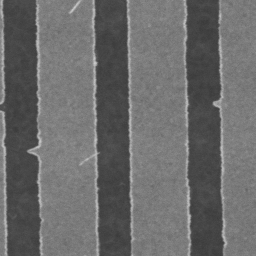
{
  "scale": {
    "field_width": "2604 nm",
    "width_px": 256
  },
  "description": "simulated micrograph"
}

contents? one or a few lines or trenches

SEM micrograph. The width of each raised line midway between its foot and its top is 594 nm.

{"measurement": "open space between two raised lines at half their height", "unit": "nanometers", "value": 337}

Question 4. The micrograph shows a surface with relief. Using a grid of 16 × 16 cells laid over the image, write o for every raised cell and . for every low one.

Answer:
..oooooooooo..oo
..oooo..oooo..oo
..oooo..oooo..oo
..oooo..oooo..oo
..oooo..oooo..oo
..oooo..oooo..oo
..oooo..oooo..oo
..oooo..oooo..oo
..oooo..oooo..oo
..oooo..oooo..oo
..oooo..oooo..oo
..oooo..oooo..oo
..oooo..oooo..oo
...ooo..oooo..oo
...ooo..oooo..oo
...ooo..oooo..oo